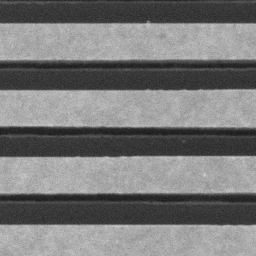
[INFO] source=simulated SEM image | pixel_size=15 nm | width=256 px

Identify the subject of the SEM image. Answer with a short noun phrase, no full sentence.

lines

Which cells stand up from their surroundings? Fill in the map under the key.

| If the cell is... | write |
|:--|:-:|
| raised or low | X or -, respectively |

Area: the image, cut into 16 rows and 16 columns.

----------------
----------------
XXXXXXXXXXXXXXXX
XXXXXXXXXXXXXXXX
----------------
----------------
XXXXXXXXXXXXXXXX
XXXXXXXXXXXXXXXX
----------------
----------------
XXXXXXXXXXXXXXXX
XXXXXXXXXXXXXXXX
----------------
----------------
XXXXXXXXXXXXXXXX
XXXXXXXXXXXXXXXX